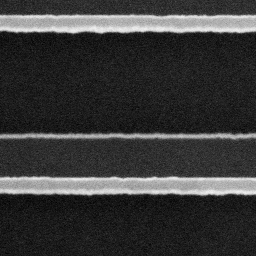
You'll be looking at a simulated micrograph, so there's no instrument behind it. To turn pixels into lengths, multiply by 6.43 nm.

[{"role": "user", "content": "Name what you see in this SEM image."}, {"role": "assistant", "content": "lines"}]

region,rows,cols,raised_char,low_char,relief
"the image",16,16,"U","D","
UUUUUUUUUUUUUUUU
UUUUUUUUUUUUUUUU
DDDDDDDDDDDDDDDD
DDDDDDDDDDDDDDDD
DDDDDDDDDDDDDDDD
DDDDDDDDDDDDDDDD
DDDDDDDDDDDDDDDD
DDDDDDDDDDDDDDDD
DDDDDDDDDDDDDDDD
UUUUUUUUUUUUUUUU
UUUUUUUUUUUUUUUU
UUUUUUUUUUUUUUUU
DDDDDDDDDDDDDDDD
DDDDDDDDDDDDDDDD
DDDDDDDDDDDDDDDD
DDDDDDDDDDDDDDDD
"